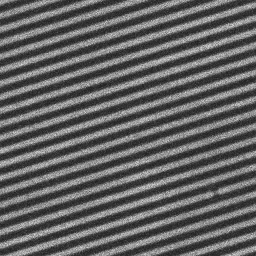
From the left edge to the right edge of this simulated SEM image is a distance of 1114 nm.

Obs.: parallel lines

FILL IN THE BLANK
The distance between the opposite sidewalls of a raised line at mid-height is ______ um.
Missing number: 0.0249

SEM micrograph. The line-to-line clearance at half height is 7.63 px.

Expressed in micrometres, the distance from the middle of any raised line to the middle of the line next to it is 0.0563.